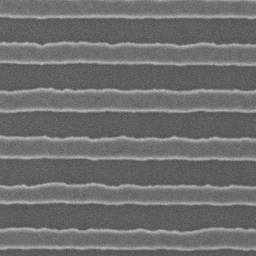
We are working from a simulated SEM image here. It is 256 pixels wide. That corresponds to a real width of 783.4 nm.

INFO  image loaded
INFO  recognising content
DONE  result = lines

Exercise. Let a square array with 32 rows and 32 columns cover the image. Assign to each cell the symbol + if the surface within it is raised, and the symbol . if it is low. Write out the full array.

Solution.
++++++++++++++++++++++++++++++++
++++++++++++++++++++++++++++++++
................................
................................
................................
+++++.++++++++.++..+....+++.....
++++++++++++++++++++++++++++++++
++++++++++++++++++++++++++++++++
................................
................................
................................
++++++++++++++++++++++++++++++++
++++++++++++++++++++++++++++++++
++++++++++++++++++++++++++++++++
................................
................................
................................
++++++++++++++++++++++++.+++++++
++++++++++++++++++++++++++++++++
++++++++++++++++++++++++++++++++
................................
................................
................................
++++++++++++++++++++++++++++++++
++++++++++++++++++++++++++++++++
..........................+++..+
................................
................................
................................
++++++++++++++++++++++++++++++++
++++++++++++++++++++++++++++++++
................................